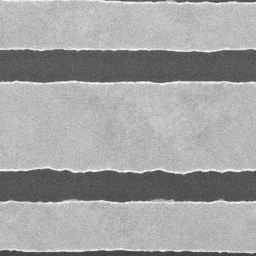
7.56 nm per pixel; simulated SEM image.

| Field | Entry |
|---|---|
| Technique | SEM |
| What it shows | lines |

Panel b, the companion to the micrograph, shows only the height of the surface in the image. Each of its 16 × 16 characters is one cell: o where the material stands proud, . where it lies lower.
oooooooooooooooo
oooooooooooooooo
oooooooooooooooo
................
................
oooooooooooooooo
oooooooooooooooo
oooooooooooooooo
oooooooooooooooo
oooooooooooooooo
oooooooooooooooo
................
................
oooooooooooooooo
oooooooooooooooo
oooooooooooooooo